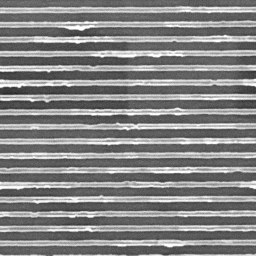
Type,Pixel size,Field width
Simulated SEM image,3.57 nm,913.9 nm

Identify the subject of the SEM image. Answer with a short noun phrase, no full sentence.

parallel lines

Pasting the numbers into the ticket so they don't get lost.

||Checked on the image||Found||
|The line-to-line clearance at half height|0.0357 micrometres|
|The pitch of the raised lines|14.6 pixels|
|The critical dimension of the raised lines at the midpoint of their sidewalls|17.9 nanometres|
